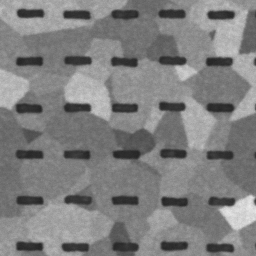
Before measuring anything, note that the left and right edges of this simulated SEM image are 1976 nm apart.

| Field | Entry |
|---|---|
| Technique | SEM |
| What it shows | a regular array of holes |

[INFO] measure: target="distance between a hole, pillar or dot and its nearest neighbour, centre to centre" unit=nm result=355